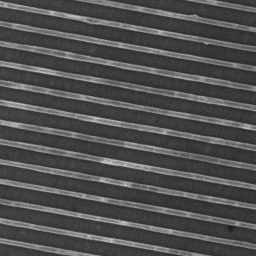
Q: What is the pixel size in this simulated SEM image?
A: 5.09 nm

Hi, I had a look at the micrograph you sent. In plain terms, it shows parallel lines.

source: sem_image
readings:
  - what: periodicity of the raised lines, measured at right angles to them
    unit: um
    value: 0.099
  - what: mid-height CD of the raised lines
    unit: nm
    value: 26.9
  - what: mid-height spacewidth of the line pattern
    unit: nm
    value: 72.1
